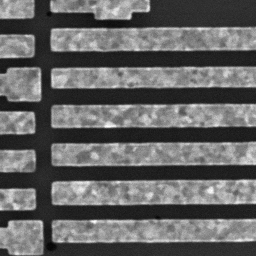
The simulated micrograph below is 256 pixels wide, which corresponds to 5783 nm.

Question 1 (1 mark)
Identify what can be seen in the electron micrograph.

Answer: wiring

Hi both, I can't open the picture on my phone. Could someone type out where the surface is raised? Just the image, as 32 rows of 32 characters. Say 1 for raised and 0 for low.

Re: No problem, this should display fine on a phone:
11110011111111111110000000000000
11110000000111111000000000000000
00000000000000000000000000000000
00000000000000000000000000000001
11110011111111111111111111111111
11110011111111111111111111111111
11110000000000000000000000000000
00000000000000000000000000000000
00011000000000010001111111111111
11111011111111111111111111111111
11111001111111111111111111111111
11111000000000000000000000000000
01111000000000000000000000000000
00000001111111111111111111111111
11110001111111111111111111111111
11110001111111111111111111111111
11110000000000000000000000000000
00000000000000000000000000000000
00000001111111111111111111111111
11110001111111111111111111111111
11110001111111111111111111111111
00000000000000000000000000000000
00000000000000000000000000000000
00000001111111111111111111111111
11110001111111111111111111111111
11110001111111111111000000000000
00000000000000000000000000000000
00000000000000000000000000000001
11111001111111111111111111111111
11111001111111111111111111111111
11111000000000000000000000000000
01111000000000000000000000000000